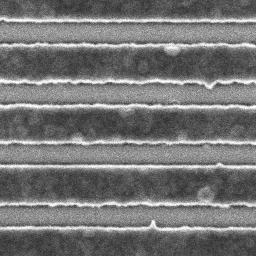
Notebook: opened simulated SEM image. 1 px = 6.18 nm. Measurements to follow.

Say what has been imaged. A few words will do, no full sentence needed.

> one or a few lines or trenches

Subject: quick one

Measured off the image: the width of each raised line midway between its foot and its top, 37.8 pixels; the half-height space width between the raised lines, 143 nm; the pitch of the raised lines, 377 nanometres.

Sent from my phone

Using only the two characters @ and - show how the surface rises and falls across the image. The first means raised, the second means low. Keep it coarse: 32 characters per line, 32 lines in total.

@@@@@@@@@@@@@@@@@@@@@@@@@@@@@@@@
@@@@@@@@@@@@@@@@@@@@@@@@@@@@@@@@
@@@@@@@@@@@@@@@@@@@@@@@@@@@@@@@@
--------------------------------
--------------------------------
--------------------@@----------
@@@@@@@@@@@@@@@@@@@@@@@@@@@@@@@@
@@@@@@@@@@@@@@@@@@@@@@@@@@@@@@@@
@@@@@@@@@@@@@@@@@@@@@@@@@@@@@@@@
@@@@@@@@@@@@@@@@@@@@@@@@@@@@@@@@
-------------------------@@-----
--------------------------------
--------------------------------
@@@@@@@@@@@@@@@@@@@@@@@@@@@@@@@@
@@@@@@@@@@@@@@@@@@@@@@@@@@@@@@@@
@@@@@@@@@@@@@@@@@@@@@@@@@@@@@@@@
@@@@@@@@@@@@@@@@@@@@@@@@@@@@@@@@
@@@@@@@@@@@@@@@@@@@@@@@@@@@@@@@@
--------------------------------
--------------------------------
--------------------------------
@@@@@@@@@@@@@@@@@@@@@@@@@@@@@@@@
@@@@@@@@@@@@@@@@@@@@@@@@@@@@@@@@
@@@@@@@@@@@@@@@@@@@@@@@@@@@@@@@@
@@@@@@@@@@@@@@@@@@@@@@@@@@@@@@@@
@@@@@@@@@@@@@-@@--@@-@@@@@@@@@@@
--------------------------------
--------------------------------
@@@@@@@@@@@@@@--@@@@------------
@@@@@@@@@@@@@@@@@@@@@@@@@@@@@@@@
@@@@@@@@@@@@@@@@@@@@@@@@@@@@@@@@
@@@@@@@@@@@@@@@@@@@@@@@@@@@@@@@@